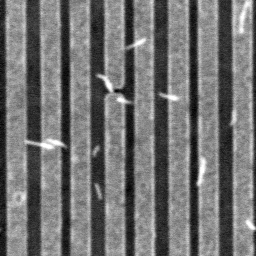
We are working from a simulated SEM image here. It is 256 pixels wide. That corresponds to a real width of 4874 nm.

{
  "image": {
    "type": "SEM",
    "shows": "parallel lines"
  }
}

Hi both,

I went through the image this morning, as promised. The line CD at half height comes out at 343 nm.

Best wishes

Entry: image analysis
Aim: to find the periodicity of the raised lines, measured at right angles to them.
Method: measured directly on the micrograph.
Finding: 616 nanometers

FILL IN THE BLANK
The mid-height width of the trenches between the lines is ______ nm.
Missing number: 309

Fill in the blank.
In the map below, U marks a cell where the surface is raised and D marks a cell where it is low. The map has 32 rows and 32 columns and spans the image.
DUUDDUUDDUUDDUUDDUUDDUUDDUUDDUUD
DUUDDUUDDUUDDUUDDUUDDUUDDUUDDUUD
DUUDDUUDDUUDDUUDDUUDDUUDDUUDDUUD
DUUDDUUDDUUDDUUDDUUDDUUDDUUDDUUD
DUUDDUUDDUUDDUUDDUUDDUUDDUUDDUUD
DUUDDUUDDUUDDUUDDUUDDUUDDUUDDUUD
DUUDDUUDDUUDDUUDDUUDDUUDDUUDDUUD
DUUDDUUDDUUDDUUDDUUDDUUDDUUDDUUD
DUUDDUUDDUUDDUUDDUUDDUUDDUUDDUUD
DUUDDUUDDUUDDUUDDUUDDUUDDUUDDUUD
DUUDDUUDDUUDDUUDDUUDDUUDDUUDDUUD
DUUDDUUDDUUDDDDDDUUDDUUDDUUDDUUD
DUUDDUUDDUUDDUUDDUUDDUUDDUUDDUUD
DUUDDUUDDUUDDUUDDUUDDUUDDUUDDUUD
DUUDDUUDDUUDDUUDDUUDDUUDDUUDDUUD
DUUDDUUDDUUDDUUDDUUDDUUDDUUDDUUD
DUUDDUUDDUUDDUUDDUUDDUUDDUUDDUUD
DUUDDUUUDUUDDUUDDUUDDUUUDUUDDUUD
DUUDDUUUDUUDDUUDDUUDDUUUDUUDDUUD
DUUDDUUDDUUDDUUDDUUDDUUUDUUDDUUD
DUUDDUUDDUUDDUUDDUUDDUUUDUUDDUUD
DUUDDUUDDUUDDUUDDUUDDUUDDUUDDUUD
DUUDDUUDDUUDDUUDDUUDDUUDDUUDDUUD
DUUDDUUUDUUDDUUDDUUDDUUDDUUDDUUD
DUUDDUUDDUUDDUUDDUUDDUUDDUUDDUUD
DUUDDUUUDUUDDUUDDUUDDUUDDUUDDUUD
DUUDDUUUDUUDDUUDDUUDDUUDDUUDDUUD
DUUDDUUUDUUDDUUDDUUDDUUDDUUDDUUD
DUUDDUUUDUUDDUUDDUUDDUUDDUUDDUUU
DUUDDUUDDUUDDUUDDUUDDUUDDUUDDUUD
DUUDDUUDDUUDDUUDDUUDDUUDDUUDDUUD
DUUDDUUDDUUDDUUDDUUDDUUDDUUDDUUU